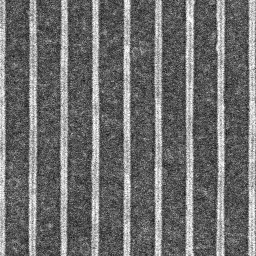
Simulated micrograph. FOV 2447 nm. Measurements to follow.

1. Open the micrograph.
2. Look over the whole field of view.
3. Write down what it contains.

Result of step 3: parallel lines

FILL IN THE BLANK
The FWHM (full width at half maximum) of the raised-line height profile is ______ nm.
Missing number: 46.6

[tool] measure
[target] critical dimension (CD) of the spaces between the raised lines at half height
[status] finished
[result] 247 nm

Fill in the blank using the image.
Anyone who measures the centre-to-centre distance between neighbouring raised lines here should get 300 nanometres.